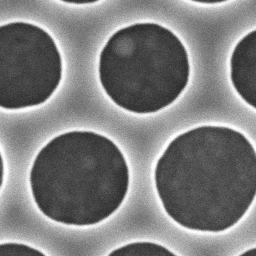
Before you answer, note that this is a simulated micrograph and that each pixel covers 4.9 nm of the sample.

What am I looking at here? holes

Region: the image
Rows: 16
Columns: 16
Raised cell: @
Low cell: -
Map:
@@@@@@@@@@@@@@@@
--@@@@@@--@@@@@@
---@@@@----@@@@-
----@@------@@--
----@@------@@--
----@@------@@@-
---@@@@----@@@@-
@@@@@@@@@@@@@@@@
@@@@--@@@@@----@
@@------@@------
@@------@@------
@@------@@------
@@------@@------
@@@----@@@@----@
@@@@@@@@@@@@@-@@
--@@@@@---@@@@@@